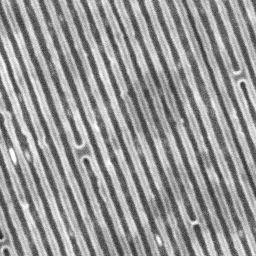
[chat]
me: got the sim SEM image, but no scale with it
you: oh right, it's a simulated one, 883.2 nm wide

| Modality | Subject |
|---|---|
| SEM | parallel lines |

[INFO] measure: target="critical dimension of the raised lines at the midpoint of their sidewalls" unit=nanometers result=21.4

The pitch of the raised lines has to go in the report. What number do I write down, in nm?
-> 46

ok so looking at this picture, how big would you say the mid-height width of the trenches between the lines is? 0.0247 microns